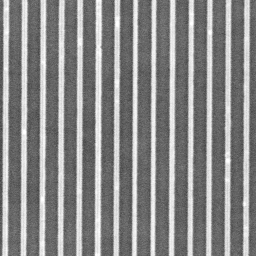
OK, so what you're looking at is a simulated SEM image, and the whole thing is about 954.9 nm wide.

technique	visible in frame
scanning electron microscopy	parallel lines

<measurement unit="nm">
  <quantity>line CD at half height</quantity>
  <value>15.8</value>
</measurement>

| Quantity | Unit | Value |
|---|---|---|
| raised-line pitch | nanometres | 69.1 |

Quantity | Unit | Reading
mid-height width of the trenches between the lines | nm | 53.6